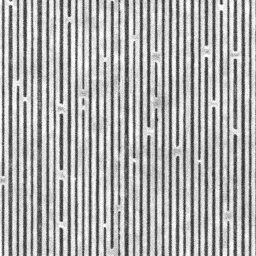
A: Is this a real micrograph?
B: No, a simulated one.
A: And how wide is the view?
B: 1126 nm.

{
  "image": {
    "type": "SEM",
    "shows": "parallel lines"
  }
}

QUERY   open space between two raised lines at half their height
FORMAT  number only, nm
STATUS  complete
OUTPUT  12.1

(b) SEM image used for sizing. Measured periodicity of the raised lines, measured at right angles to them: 0.0319 µm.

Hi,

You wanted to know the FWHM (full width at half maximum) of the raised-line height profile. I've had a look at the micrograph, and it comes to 16.5 nm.